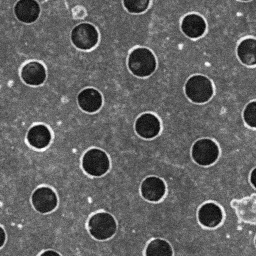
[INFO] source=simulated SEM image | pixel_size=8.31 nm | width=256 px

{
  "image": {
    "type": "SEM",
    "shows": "a regular array of holes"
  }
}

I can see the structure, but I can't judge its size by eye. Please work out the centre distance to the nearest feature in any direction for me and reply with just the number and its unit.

523 nm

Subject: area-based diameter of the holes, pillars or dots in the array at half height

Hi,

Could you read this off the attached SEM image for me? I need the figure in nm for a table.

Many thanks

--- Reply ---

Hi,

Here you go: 221